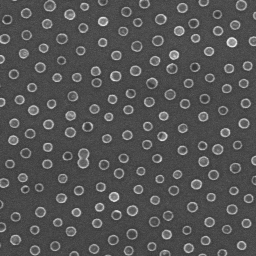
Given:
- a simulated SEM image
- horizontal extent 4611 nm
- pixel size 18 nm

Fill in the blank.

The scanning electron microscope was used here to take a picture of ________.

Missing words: a regular array of raised bodies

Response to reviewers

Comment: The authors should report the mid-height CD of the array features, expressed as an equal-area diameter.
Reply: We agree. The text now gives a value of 9.03 pixels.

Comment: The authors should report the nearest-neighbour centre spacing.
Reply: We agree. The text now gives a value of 323 nanometres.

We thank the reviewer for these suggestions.